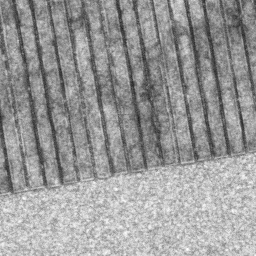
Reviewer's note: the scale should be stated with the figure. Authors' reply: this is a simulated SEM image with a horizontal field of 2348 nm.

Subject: parallel lines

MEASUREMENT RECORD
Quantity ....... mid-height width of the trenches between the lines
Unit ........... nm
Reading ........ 35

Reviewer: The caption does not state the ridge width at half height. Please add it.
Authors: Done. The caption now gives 119 nm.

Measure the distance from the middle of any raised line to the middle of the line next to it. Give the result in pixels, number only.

16.9